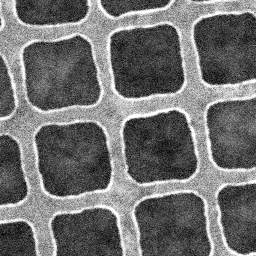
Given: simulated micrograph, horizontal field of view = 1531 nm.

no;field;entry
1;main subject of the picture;holes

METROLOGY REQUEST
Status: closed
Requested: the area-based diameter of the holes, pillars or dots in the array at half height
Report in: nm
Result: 474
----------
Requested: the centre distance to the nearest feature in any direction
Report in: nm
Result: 514